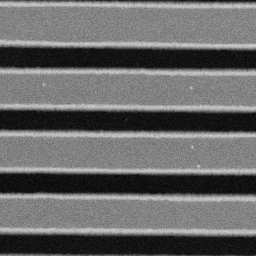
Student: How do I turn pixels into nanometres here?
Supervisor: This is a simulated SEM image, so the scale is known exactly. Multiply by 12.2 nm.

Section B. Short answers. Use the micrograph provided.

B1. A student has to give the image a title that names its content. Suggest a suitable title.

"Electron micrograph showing lines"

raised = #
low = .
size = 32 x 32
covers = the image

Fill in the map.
################################
################################
################################
################################
################################
################################
................................
................................
................................
################################
################################
################################
################################
################################
................................
................................
##########################......
################################
################################
################################
################################
################################
................................
................................
################################
################################
################################
################################
################################
................................
................................
................................